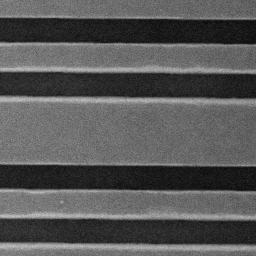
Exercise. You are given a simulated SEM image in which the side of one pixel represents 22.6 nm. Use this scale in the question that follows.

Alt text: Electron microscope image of lines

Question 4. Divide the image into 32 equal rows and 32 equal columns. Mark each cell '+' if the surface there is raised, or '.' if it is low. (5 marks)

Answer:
++++++++++++++++++++++++++++++++
++++++++++++++++++++++++++++++++
................................
................................
................................
++++++++++++++++++++..++........
++++++++++++++++++++++++++++++++
++++++++++++++++++++++++++++++++
++++++++++++++++++++++++++++++++
................................
................................
................................
++++++++++++++++++++++++++++++++
++++++++++++++++++++++++++++++++
++++++++++++++++++++++++++++++++
++++++++++++++++++++++++++++++++
++++++++++++++++++++++++++++++++
++++++++++++++++++++++++++++++++
++++++++++++++++++++++++++++++++
++++++++++++++++++++++++++++++++
++++++++++++++++++++++++++++++++
................................
................................
................................
++++++++++++++++++++++++++++++++
++++++++++++++++++++++++++++++++
++++++++++++++++++++++++++++++++
................................
................................
................................
++++++++++++....................
++++++++++++++++++++++++++++++++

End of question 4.